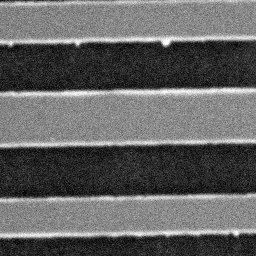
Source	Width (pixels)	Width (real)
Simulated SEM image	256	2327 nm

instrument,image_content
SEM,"lines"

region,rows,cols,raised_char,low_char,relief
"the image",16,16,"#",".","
################
################
###########.....
................
................
................
################
################
################
................
................
................
################
################
################
................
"